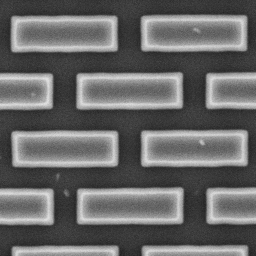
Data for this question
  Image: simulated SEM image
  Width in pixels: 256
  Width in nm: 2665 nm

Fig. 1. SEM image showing groups of lines, slits or small figures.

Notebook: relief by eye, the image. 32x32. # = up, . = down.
................................
................................
..############....############..
..############....#############.
..############....#############.
..############....############..
................................
................................
................................
............#.......##.....#####
######....############....######
######....#############...######
######....#############...######
................................
................................
................................
................................
..############....#############.
..############....#############.
..############....#############.
...##...#.......................
................................
................................
................................
######....#############...######
######....#############...######
######....#############...######
######....############....######
................................
................................
................................
..############....#############.